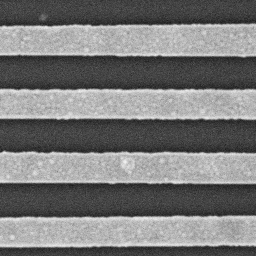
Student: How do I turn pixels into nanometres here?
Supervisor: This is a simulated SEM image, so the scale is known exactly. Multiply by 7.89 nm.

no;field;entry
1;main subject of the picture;lines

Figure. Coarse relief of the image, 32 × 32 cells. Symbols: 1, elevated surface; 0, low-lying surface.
00000000000000000000000000000000
00000000000000000000000000000000
00000000000000000000000000000000
11111111111111111111111111111111
11111111111111111111111111111111
11111111111111111111111111111111
11111111111111111111111111111111
00000000000000000000000000000000
00000000000000000000000000000000
00000000000000000000000000000000
00000000000000000000000000000000
11111111111111111111111111111111
11111111111111111111111111111111
11111111111111111111111111111111
11111111111111111111111111111111
00000000000000000000000000000000
00000000000000000000000000000000
00000000000000000000000000000000
00000000000000000000000000000000
11111111111111111111111111111111
11111111111111111111111111111111
11111111111111111111111111111111
11111111111111111111111111111111
00000000000000000000000000000000
00000000000000000000000000000000
00000000000000000000000000000000
00000000000000000000000000000000
11111111111111111111111111111111
11111111111111111111111111111111
11111111111111111111111111111111
11111111111111111111111111111111
00000000000000000000000000000000